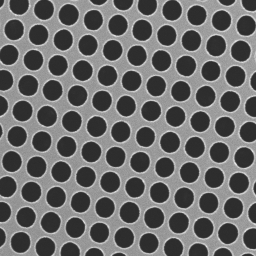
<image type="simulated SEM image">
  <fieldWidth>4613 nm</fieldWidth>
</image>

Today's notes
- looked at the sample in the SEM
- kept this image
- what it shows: a regular array of holes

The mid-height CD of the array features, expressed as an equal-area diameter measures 358 nm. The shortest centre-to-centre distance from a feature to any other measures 452 nm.